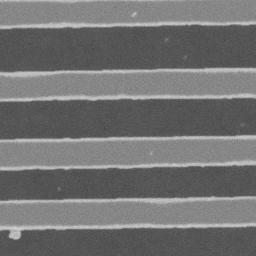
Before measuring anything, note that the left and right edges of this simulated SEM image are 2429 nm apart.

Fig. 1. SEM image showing lines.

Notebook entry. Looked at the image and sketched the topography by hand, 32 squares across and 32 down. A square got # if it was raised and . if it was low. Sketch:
################################
################################
################################
................................
................................
................................
................................
................................
................................
################################
################################
################################
##..............................
................................
................................
................................
................................
.......#########################
################################
################################
#############################...
................................
................................
................................
................................
################################
################################
################################
############....................
................................
................................
................................